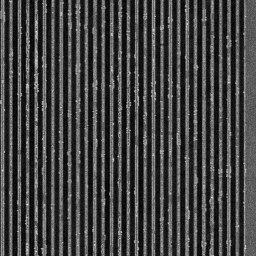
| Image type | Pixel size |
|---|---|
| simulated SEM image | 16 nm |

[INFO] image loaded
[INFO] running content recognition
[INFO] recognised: parallel lines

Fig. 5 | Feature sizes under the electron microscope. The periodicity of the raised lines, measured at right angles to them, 134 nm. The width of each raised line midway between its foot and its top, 48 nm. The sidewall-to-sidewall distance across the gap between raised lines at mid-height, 80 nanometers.